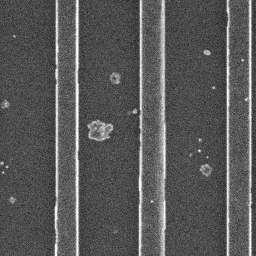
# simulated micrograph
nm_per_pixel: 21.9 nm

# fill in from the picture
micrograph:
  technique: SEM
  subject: lines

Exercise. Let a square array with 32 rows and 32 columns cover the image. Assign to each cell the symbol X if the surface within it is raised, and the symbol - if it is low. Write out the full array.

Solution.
-------XXX--------XX---------XX-
-------XXX--------XX---------XX-
-------XXX--------XX---------XX-
-------XXX--------XX---------XX-
-------XXX--------XX---------XX-
-------XXX--------XX---------XX-
-------XXX--------XX---------XX-
-------XXX--------XX---------XX-
-------XXX--------XX---------XX-
-------XXX--------XX---------XX-
-------XXX--------XX---------XX-
-------XXX--------XX---------XX-
-------XXX--------XX---------XX-
-------XXX--------XX---------XX-
-------XXX--------XX---------XX-
-------XXX--------XX---------XX-
-------XXX--X-----XX---------XX-
-------XXX--------XX---------XX-
-------XXX--------XX---------XX-
-------XXX--------XX---------XX-
-------XXX--------XX---------XX-
-------XXX--------XX---------XX-
-------XXX--------XX---------XX-
-------XXX--------XX---------XX-
-------XXX--------XX---------XX-
-------XXX--------XX---------XX-
-------XXX--------XX---------XX-
-------XXX--------XX---------XX-
-------XXX--------XX---------XX-
-------XXX--------XX---------XX-
-------XXX--------XX---------XX-
-------XXX--------XX---------XX-